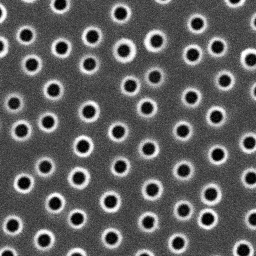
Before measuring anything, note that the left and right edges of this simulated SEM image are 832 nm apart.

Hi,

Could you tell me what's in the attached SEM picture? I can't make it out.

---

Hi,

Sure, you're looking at a regular array of holes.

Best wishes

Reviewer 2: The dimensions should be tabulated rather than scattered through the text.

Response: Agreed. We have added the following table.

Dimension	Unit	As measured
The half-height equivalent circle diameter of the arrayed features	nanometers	42.8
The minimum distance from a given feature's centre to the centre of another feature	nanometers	103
